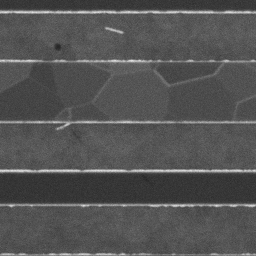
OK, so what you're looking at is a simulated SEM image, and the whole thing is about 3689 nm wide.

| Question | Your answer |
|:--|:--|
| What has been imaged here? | lines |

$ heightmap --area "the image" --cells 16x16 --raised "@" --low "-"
@@@@@@@@@@@@@@@@
----------------
----------------
----------------
@@@@@@@@@@@@@@@@
@@@@@@@@@@@@@@@@
@@@@@@@@@@@@@@@@
@@@@@@@@@@@@@@@@
----------------
----------------
----------------
@@@@@@@@@@@@@@@@
@@@@@@@@@@@@@@@@
----------------
----------------
----------------